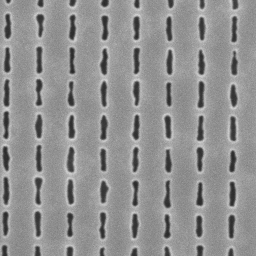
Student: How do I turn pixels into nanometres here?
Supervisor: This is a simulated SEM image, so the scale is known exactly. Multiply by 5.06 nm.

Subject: a regular array of holes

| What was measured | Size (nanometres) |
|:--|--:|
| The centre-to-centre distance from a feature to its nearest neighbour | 160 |